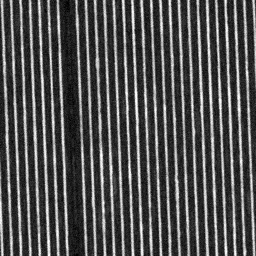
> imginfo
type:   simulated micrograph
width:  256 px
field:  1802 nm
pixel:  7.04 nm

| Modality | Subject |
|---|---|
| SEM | parallel lines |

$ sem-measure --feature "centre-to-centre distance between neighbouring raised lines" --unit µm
0.0656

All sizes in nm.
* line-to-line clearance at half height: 54.5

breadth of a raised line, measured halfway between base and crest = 10.6 nm